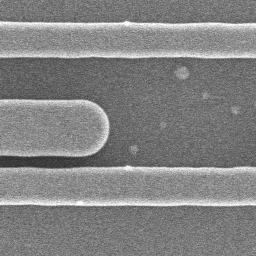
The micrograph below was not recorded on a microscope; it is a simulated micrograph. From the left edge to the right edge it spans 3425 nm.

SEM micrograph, groups of lines, slits or small figures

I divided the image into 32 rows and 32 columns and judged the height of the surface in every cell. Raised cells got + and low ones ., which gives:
................................
................................
................................
++++++++++++++++++++++++++++++++
++++++++++++++++++++++++++++++++
++++++++++++++++++++++++++++++++
++++++++++++++++++++++++++++++++
................................
................................
................................
................................
................................
................................
++++++++++++....................
+++++++++++++...................
++++++++++++++..................
++++++++++++++..................
+++++++++++++...................
+++++++++++++...................
..+++...+++.....................
................................
++++++++++++++++++++++++++++++++
++++++++++++++++++++++++++++++++
++++++++++++++++++++++++++++++++
++++++++++++++++++++++++++++++++
.....++..++++++..++++++.+++++++.
................................
................................
................................
................................
................................
................................